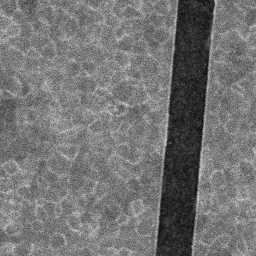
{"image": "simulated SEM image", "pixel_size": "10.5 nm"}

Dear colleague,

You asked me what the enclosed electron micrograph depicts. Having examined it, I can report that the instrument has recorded one or a few lines or trenches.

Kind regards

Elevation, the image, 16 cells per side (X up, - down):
XXXXXXXXXXX--XXX
XXXXXXXXXXX--XXX
XXXXXXXXXXX--XXX
XXXXXXXXXXX--XXX
XXXXXXXXXXX--XXX
XXXXXXXXXXX--XXX
XXXXXXXXXXX--XXX
XXXXXXXXXX---XXX
XXXXXXXXXX---XXX
XXXXXXXXXX---XXX
XXXXXXXXXX---XXX
XXXXXXXXXX--XXXX
XXXXXXXXXX--XXXX
XXXXXXXXXX--XXXX
XXXXXXXXXX--XXXX
XXXXXXXXXX--XXXX